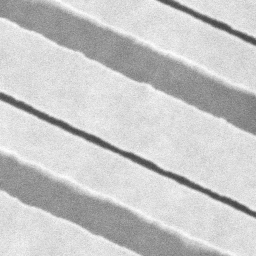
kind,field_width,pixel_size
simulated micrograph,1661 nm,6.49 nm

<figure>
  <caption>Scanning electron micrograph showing lines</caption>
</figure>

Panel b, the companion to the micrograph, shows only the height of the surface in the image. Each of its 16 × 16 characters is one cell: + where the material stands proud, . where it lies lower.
....++++++++++++
+.....++++++++++
+++......+++++++
+++++......+++++
+++++++......+++
++++++++++.....+
++++++++++++....
++++++++++++++..
++++++++++++++++
++++++++++++++++
...+++++++++++++
.....+++++++++++
+......+++++++++
+++......+++++++
++++++.....+++++
++++++++.....+++